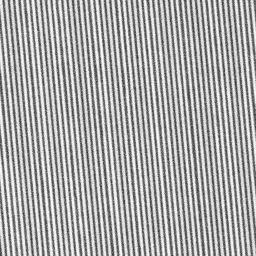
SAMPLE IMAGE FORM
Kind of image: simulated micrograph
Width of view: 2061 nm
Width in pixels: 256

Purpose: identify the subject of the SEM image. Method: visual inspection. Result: parallel lines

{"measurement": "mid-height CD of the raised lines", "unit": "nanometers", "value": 21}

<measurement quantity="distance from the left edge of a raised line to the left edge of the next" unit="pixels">5.32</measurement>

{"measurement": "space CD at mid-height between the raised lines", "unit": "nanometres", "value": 21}